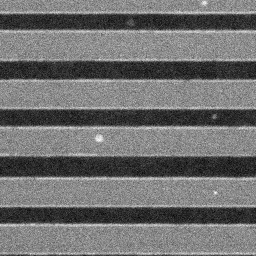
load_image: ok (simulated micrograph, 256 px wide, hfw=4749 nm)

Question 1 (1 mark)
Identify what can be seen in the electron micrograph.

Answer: lines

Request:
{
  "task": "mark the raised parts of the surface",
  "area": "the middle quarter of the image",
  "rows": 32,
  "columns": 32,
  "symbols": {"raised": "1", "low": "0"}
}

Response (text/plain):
11111111111111111111111111111111
11111111111111111111111111111111
11111111111111111111111111111111
11111111111111111111111111111111
00000000000000000000000000000000
00000000000000000000000000000000
00000000000000000000000000000000
00000000000000000000000000000000
00000000000000000000000000000000
00000000000000000000000000000000
00000000000000000000000000000000
11111111111111111111111111111111
11111111111111111111111111111111
11111111111111111111111111111111
11111111111111111111111111111111
11111111111111111111111111111111
00000000000000000000000000000000
00000000000000000000000000000000
00000000000000000000000000000000
00000000000000000000000000000000
00000000000000000000000000000000
00000000000000000000000000000000
00000000000000000000000000000000
11111111111111111111111111111111
11111111111111111111111111111111
11111111111111111111111111111111
11111111111111111111111111111111
11111111111111111111111111111111
00001010000001111111111111001110
00000000000000000000000000000000
00000000000000000000000000000000
00000000000000000000000000000000